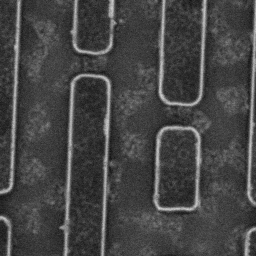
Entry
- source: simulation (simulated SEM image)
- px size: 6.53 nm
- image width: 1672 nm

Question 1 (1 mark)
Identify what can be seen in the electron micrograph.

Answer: one or a few lines or trenches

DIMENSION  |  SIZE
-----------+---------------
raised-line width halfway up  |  0.249 micrometres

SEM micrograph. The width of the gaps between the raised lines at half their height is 338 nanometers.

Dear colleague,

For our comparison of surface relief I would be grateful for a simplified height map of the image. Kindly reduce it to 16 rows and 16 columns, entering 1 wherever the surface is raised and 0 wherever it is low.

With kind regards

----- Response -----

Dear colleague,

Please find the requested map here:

1000011000111000
1000011000111000
1000011000111000
1000000000111000
1000000000111000
1000111000111000
1000111000010000
1000111000000000
1000111000110000
1000111000110000
1000111000110000
1000111000110000
0000111000110000
0000110000000000
1000110000000000
1000110000000001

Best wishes